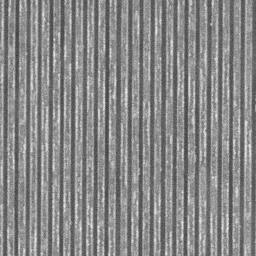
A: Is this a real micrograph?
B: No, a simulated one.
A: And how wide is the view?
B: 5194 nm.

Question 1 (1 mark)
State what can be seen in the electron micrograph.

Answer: parallel lines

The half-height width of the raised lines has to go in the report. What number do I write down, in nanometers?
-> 137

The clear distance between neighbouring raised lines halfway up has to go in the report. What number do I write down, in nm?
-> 86.2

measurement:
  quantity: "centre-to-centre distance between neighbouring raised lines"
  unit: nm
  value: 229